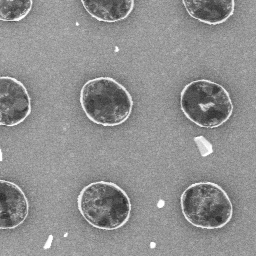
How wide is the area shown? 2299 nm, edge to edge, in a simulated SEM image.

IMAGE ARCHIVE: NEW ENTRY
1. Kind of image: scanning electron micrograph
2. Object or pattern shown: raised bodies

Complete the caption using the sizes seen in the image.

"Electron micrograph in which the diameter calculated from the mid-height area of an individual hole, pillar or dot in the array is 433 nanometres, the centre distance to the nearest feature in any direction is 907 nanometers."